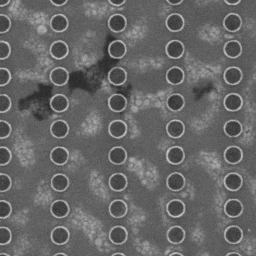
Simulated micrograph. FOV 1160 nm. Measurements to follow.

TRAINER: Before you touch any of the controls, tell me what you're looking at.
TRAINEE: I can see a regular array of raised bodies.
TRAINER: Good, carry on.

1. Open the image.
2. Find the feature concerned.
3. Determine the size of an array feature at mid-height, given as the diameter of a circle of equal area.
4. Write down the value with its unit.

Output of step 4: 0.081 micrometres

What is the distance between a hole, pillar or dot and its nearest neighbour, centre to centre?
119 nanometers